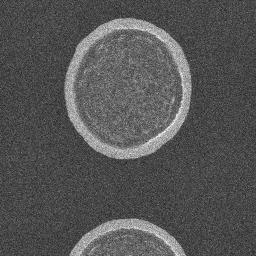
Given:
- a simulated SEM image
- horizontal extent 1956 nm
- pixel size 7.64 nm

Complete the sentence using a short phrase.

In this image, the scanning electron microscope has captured raised bodies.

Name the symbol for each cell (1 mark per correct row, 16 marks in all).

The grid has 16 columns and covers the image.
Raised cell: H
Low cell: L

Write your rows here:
LLLLLLLLLLLLLLLL
LLLLLLLLLLLLLLLL
LLLLLLHHHHLLLLLL
LLLLLHHHHHHLLLLL
LLLLHHHHHHHHLLLL
LLLLHHHHHHHHLLLL
LLLLHHHHHHHHLLLL
LLLLLHHHHHHLLLLL
LLLLLHHHHHLLLLLL
LLLLLLLHHLLLLLLL
LLLLLLLLLLLLLLLL
LLLLLLLLLLLLLLLL
LLLLLLLLLLLLLLLL
LLLLLLLLLLLLLLLL
LLLLLLHHHHLLLLLL
LLLLLHHHHHHLLLLL